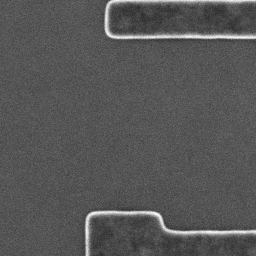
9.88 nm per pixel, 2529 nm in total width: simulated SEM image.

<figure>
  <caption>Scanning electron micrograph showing wiring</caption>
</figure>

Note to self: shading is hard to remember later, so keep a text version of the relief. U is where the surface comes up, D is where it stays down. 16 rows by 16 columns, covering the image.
DDDDDDDUUUUUUUUU
DDDDDDDUUUUUUUUU
DDDDDDDDDDDDDDDD
DDDDDDDDDDDDDDDD
DDDDDDDDDDDDDDDD
DDDDDDDDDDDDDDDD
DDDDDDDDDDDDDDDD
DDDDDDDDDDDDDDDD
DDDDDDDDDDDDDDDD
DDDDDDDDDDDDDDDD
DDDDDDDDDDDDDDDD
DDDDDDDDDDDDDDDD
DDDDDDDDDDDDDDDD
DDDDDDUUUUDDDDDD
DDDDDUUUUUUUUUUU
DDDDDUUUUUUUUUUU